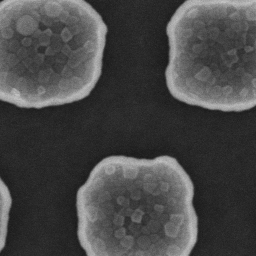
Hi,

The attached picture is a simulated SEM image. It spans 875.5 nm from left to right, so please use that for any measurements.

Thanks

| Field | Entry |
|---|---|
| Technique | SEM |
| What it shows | raised bodies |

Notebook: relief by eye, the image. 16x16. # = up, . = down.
######.....#####
######.....#####
######.....#####
######.....#####
######.....#####
######.....#####
.##.........####
................
................
................
......#####.....
.....#######....
.....#######....
.....#######....
.....#######....
.....#######....